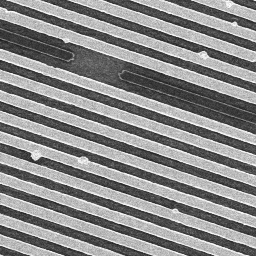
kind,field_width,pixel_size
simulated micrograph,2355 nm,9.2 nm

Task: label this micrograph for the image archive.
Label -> parallel lines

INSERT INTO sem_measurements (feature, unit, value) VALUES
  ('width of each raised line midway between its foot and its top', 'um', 0.0949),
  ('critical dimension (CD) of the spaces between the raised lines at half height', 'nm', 88.4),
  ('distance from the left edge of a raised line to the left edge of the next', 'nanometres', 180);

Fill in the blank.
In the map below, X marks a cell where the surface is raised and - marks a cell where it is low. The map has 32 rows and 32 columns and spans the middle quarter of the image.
-------------------XXXXXXXXX----
-----------------------XXXXXXXX-
XXX-----------XXXX-------XXXXXXX
XXXXXX--------XXXXXXX--------XXX
-XXXXXXXX-------XXXXXXXX-------X
----XXXXXXX---------XXXXXXX-----
-------XXXXXXX---------XXXXXXX--
XX--------XXXXXXX---------XXXXXX
XXXXX--------XXXXXXX---------XXX
XXXXXXXX--------XXXXXXX---------
---XXXXXXXX--------XXXXXXX------
------XXXXXXXX--------XXXXXXX---
XX-------XXXXXXXX--------XXXXXXX
XXXXX-------XXXXXXXX--------XXXX
XXXXXXXX-------XXXXXXXX--------X
---XXXXXXXX-------XXXXXXXX------
-----XXXXXXXXX-------XXXXXXXX---
XX-------XXXXXXXX-------XXXXXXXX
XXXXX------XXXXXXXXX-------XXXXX
XXXXXXX--------XXXXXXXX-------XX
--XXXXXXXX--------XXXXXXXX------
-----XXXXXXXX--------XXXXXXXX---
X-------XXXXXXXX--------XXXXXXX-
XXXXXX-----XXXXXXXX--------XXXXX
XXXXXXX-------XXXXXXXX--------XX
--XXXXXXXX-------XXXXXXXX-------
-----XXXXXXXX-------XXXXXXXX----
--------XXXXXXXX-------XXXXXXXX-
XXX--------XXXXXXXX-------XXXXXX
XXXXXX-------XXXXXXXXX-------XXX
-XXXXXXXX--------XXXXXXXX-------
----XXXXXXXX--------XXXXXXXX----